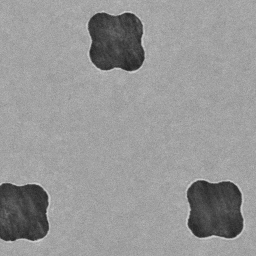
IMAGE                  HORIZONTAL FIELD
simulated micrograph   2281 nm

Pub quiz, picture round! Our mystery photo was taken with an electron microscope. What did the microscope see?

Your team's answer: holes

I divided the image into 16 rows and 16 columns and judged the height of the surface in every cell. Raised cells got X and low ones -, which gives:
XXXXXXXXXXXXXXXX
XXXXXX---XXXXXXX
XXXXXX---XXXXXXX
XXXXXX---XXXXXXX
XXXXXXXXXXXXXXXX
XXXXXXXXXXXXXXXX
XXXXXXXXXXXXXXXX
XXXXXXXXXXXXXXXX
XXXXXXXXXXXXXXXX
XXXXXXXXXXXXXXXX
XXXXXXXXXXXXXXXX
-XXXXXXXXXXX---X
---XXXXXXXXX---X
---XXXXXXXXX---X
---XXXXXXXXX---X
XXXXXXXXXXXXXXXX